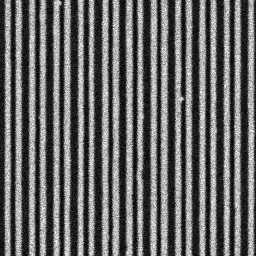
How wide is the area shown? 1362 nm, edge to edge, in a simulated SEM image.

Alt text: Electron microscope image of parallel lines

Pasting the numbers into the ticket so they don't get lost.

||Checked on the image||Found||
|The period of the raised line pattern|64.8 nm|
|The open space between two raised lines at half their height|6.37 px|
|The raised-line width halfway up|28.6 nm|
